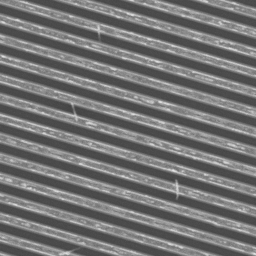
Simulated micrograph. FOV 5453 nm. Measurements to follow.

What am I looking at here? parallel lines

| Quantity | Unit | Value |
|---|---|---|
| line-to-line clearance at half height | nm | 215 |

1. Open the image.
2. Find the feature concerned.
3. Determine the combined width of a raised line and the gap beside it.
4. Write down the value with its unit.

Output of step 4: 406 nm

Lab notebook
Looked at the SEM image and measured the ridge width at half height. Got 197 nanometers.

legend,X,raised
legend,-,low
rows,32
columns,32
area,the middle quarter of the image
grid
----XXXXXXXX---------XXXXXXX----
-------XXXXXXXX---------XXXXXXXX
X----------XXXXXXX----------XXXX
XXXXX---------XXXXXXX----------X
XXXXXXXX---------XXXXXXXX-------
---XXXXXXXXX---------XXXXXXX----
-------XXXXXXXX---------XXXXXXXX
X---------XXXXXXXXX---------XXXX
XXXXX---------XXXXXXXX---------X
-XXXXXXX---------XXXXXXXXX------
----XXXXXXXX---------XXXXXXXX---
--------XXXXXXX---------XXXXXXXX
XXX--------XXXXXXX----------XXXX
XXXXX---------XXXXXXXX---------X
-XXXXXXXX---------XXXXXXX-------
----XXXXXXXX---------XXXXXXXX---
--------XXXXXXXX---------XXXXXXX
XX----------XXXXXXX---------XXXX
XXXXX----------XXXXXXXX---------
-XXXXXXXX----------XXXXXXX------
-----XXXXXXX----------XXXXXXX---
--------XXXXXXX----------XXXXXXX
XX---------XXXXXXXX----------XXX
XXXXXX---------XXXXXXX----------
-XXXXXXXX---------XXXXXXXX------
----XXXXXXXXX---------XXXXXXX---
--------XXXXXXXX---------XXXXXXX
XX---------XXXXXXXXX---------XXX
XXXXXX---------XXXXXXXX---------
--XXXXXXX---------XXXXXXXX------
-----XXXXXXXX---------XXXXXXXX--
--------XXXXXXXX---------XXXXXXX